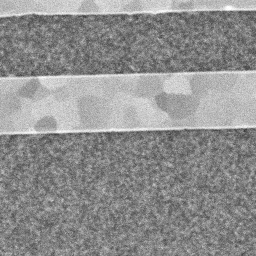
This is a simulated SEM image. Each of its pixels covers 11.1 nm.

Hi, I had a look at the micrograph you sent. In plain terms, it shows one or a few lines or trenches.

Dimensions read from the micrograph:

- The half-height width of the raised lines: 611 nm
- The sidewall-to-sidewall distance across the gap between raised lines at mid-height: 693 nm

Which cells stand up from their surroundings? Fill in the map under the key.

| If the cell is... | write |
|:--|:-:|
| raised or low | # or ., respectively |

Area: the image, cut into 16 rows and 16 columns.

################
................
................
................
...............#
################
################
################
................
................
................
................
................
................
................
................